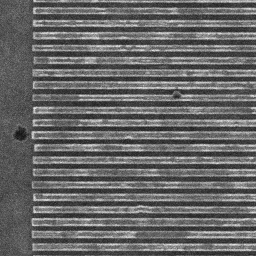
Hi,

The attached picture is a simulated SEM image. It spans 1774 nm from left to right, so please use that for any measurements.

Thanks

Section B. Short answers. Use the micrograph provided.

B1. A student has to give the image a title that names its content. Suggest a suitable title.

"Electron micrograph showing parallel lines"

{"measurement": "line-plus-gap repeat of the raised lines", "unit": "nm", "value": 86.2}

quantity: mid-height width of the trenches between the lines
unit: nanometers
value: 38.1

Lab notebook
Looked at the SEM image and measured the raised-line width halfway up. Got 6.62 pixels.